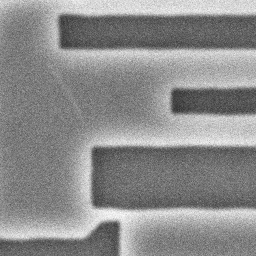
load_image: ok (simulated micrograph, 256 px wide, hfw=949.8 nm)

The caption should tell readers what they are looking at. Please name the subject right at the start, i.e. groups of lines, slits or small figures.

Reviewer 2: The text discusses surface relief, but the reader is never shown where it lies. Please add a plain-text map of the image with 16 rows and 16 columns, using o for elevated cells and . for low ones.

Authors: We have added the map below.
oooooooooooooooo
oooo............
oooo............
oooooooooooooooo
oooooooooooooooo
ooooooooooo.....
ooooooooooo.....
oooooooooooooooo
oooooooooooooooo
oooooo..........
oooooo..........
oooooo..........
oooooo..........
oooooooooooooooo
oooooo..oooooooo
........oooooooo